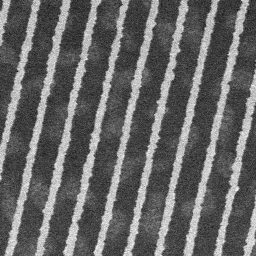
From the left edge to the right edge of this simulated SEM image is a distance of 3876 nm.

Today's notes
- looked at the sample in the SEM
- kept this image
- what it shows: parallel lines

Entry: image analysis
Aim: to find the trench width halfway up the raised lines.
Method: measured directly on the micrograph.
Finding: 338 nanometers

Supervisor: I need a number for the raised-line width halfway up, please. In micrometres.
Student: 0.0978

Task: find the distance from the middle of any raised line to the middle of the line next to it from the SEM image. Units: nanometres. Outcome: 439